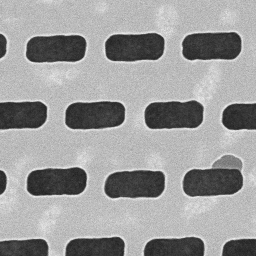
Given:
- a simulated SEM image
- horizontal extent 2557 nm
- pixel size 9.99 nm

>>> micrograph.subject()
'a regular array of holes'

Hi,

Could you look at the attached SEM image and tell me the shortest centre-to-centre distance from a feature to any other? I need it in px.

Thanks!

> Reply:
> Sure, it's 77.1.